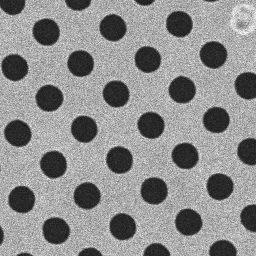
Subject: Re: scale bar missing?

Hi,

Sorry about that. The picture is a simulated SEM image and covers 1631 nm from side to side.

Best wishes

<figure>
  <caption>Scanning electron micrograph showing a regular array of holes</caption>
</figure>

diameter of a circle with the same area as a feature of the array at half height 172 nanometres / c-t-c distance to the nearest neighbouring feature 294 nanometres